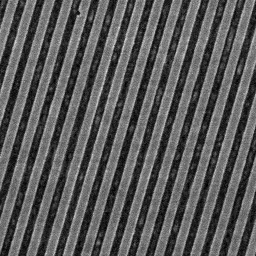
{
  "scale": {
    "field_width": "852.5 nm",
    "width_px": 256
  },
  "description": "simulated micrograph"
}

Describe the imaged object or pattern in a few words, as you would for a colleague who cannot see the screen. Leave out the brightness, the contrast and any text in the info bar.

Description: parallel lines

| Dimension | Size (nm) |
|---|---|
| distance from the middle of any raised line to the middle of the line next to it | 58.3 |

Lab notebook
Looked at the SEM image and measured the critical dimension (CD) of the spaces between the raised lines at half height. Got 29.2 nanometres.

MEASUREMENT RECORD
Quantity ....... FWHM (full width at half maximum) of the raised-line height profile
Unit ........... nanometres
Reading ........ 29.2